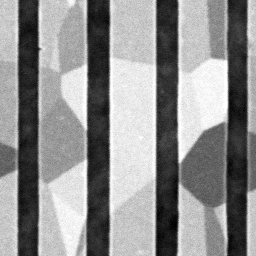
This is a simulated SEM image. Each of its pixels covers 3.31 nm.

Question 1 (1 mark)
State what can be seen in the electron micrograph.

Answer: one or a few lines or trenches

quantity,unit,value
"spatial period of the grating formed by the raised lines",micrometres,0.232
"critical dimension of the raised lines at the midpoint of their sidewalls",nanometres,154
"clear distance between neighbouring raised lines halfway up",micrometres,0.0767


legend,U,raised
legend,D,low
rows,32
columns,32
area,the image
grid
UUDDDUUUUUUDDDUUUUUDDDUUUUUUDDDU
UUDDDUUUUUUDDDUUUUUDDDDUUUUUDDDU
UUDDDUUUUUUDDDUUUUUDDDUUUUUUDDDU
UUDDDUUUUUUDDDUUUUUDDDUUUUUUDDDU
UUDDDUUUUUUDDDUUUUUDDDUUUUUUDDDU
UUDDDUUUUUUDDDUUUUUDDDUUUUUUDDDU
UUDDDUUUUUUDDDUUUUUDDDUUUUUUDDDU
UUDDDUUUUUUDDDUUUUUDDDUUUUUUDDDU
UUDDDUUUUUUDDDUUUUUDDDDUUUUUDDDU
UUDDDUUUUUUDDDUUUUUDDDDUUUUUDDDU
UUDDDUUUUUUDDDUUUUUDDDUUUUUUDDDU
UUDDDUUUUUUDDDUUUUUDDDUUUUUUDDDU
UUDDDUUUUUUDDDUUUUUDDDUUUUUUDDDU
UUDDDUUUUUUDDDUUUUUDDDUUUUUUDDDU
UUDDDUUUUUUDDDUUUUUDDDUUUUUUDDDU
UUDDDUUUUUUDDDUUUUUDDDUUUUUUDDDU
UUDDDUUUUUUDDDUUUUUDDDUUUUUUDDDU
UUDDDUUUUUUDDDUUUUUDDDUUUUUUDDDU
UUDDDUUUUUUDDDUUUUUDDDUUUUUUDDDU
UUDDDUUUUUUDDDUUUUUDDDUUUUUUDDDU
UUDDDUUUUUUDDDUUUUUDDDUUUUUUDDDU
UUDDDUUUUUUDDDUUUUUDDDUUUUUUDDDU
UUDDDUUUUUUDDDUUUUUDDDUUUUUUDDDU
UUDDDUUUUUUDDDUUUUUDDDUUUUUUDDDU
UUDDDUUUUUUDDDUUUUUDDDUUUUUUDDDU
UUDDDUUUUUUDDDUUUUUDDDUUUUUUDDDU
UUDDDUUUUUUDDDUUUUUDDDUUUUUUDDDU
UUDDDUUUUUUDDDUUUUUDDDUUUUUUDDDU
UUDDDUUUUUUDDDUUUUUDDDUUUUUUDDDU
UUDDDUUUUUUDDDUUUUUDDDUUUUUUDDDU
UUDDDUUUUUUDDDUUUUUDDDUUUUUUDDDU
UUDDDUUUUUUDDDUUUUUDDDUUUUUUDDDU